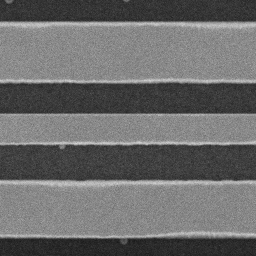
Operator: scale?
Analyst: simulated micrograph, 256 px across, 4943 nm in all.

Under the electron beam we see lines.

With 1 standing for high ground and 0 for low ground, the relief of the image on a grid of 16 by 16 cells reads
0000000000000000
1111111111111111
1111111111111111
1111111111111111
1111111111111111
0000000000000000
0000000000000000
1111111111111111
1111111111111111
0000000000000000
0000000000000000
1111111111111111
1111111111111111
1111111111111111
1111111111111111
0000000000000000